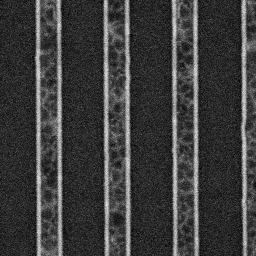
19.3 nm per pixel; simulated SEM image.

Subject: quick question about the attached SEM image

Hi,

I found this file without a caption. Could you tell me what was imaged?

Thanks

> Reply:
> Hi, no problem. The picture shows one or a few lines or trenches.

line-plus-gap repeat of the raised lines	1320	nanometres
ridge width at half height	0.399	um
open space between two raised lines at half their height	906	nm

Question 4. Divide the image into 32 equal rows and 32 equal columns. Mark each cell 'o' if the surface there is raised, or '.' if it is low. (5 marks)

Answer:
.....oo......ooo......oo.......o
.....oo......ooo......oo.......o
.....oo......ooo......oo.......o
.....oo......ooo......oo.......o
.....oo......ooo......oo.......o
.....oo......ooo......oo.......o
.....oo......ooo......oo.......o
.....oo......ooo......oo.......o
.....oo......ooo......oo.......o
.....oo......ooo......oo.......o
.....oo......ooo......oo.......o
.....oo......ooo......oo.......o
.....oo......ooo......oo.......o
.....oo......ooo......oo.......o
.....oo......ooo......oo.......o
.....oo......ooo......oo......oo
.....oo......ooo......oo......oo
.....oo......ooo......oo......oo
.....oo......ooo......oo.......o
.....oo......ooo......oo.......o
.....oo......ooo......oo.......o
.....oo......ooo......oo.......o
.....oo......ooo......oo.......o
.....oo......ooo......oo.......o
.....oo......ooo......oo.......o
.....oo......ooo......oo.......o
.....oo......ooo......oo.......o
.....oo......ooo......oo.......o
.....oo......ooo......oo.......o
.....oo......ooo......oo.......o
.....oo......ooo......ooo......o
.....oo......ooo......oo.......o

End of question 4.